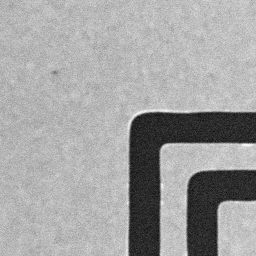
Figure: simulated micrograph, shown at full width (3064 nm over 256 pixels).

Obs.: groups of lines, slits or small figures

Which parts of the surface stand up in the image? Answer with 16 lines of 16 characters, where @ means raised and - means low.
@@@@@@@@@@@@@@@@
@@@@@@@@@@@@@@@@
@@@@@@@@@@@@@@@@
@@@@@@@@@@@@@@@@
@@@@@@@@@@@@@@@@
@@@@@@@@@@@@@@@@
@@@@@@@@@@@@@@@@
@@@@@@@@--------
@@@@@@@@--------
@@@@@@@@--@@@@@@
@@@@@@@@--@@@@@@
@@@@@@@@--@@----
@@@@@@@@--@@----
@@@@@@@@--@@--@@
@@@@@@@@--@@--@@
@@@@@@@@--@@--@@